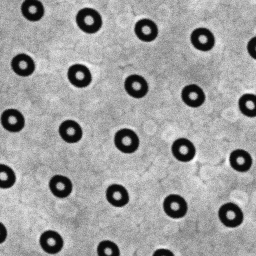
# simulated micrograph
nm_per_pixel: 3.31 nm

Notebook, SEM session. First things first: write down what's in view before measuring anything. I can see a regular array of ring-shaped grooves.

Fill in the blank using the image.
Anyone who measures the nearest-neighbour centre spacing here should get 0.184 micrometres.